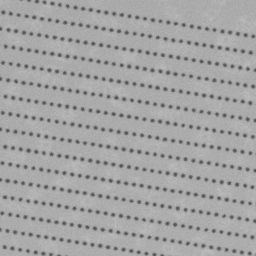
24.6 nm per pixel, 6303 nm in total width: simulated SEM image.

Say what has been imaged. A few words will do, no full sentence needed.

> a regular array of holes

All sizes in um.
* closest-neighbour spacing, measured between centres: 0.19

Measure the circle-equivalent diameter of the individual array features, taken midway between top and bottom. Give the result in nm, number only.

100